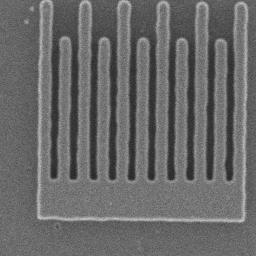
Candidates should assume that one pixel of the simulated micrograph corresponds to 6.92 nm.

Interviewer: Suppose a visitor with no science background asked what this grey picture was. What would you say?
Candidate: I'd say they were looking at groups of lines, slits or small figures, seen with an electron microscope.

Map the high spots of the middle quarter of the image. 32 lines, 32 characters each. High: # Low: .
##..##...##..###..###..###..###.
##..##...##...##..###..###..###.
##..###..##...##..###..###..###.
##..###..##..###..###..###..###.
##..##...##..###..###..###..###.
##..##...##..###..###..###..###.
##..##..###...##..###..###..###.
##..##..###..###..###..###..##..
##..##..###..###..###..###..###.
##..##..###..###..###..###..###.
##..##..###..###..###..###..###.
##..##..####.###..###..###..###.
##..##..####.###..###..###..###.
#...##..###..###..###..###..###.
#...##..###..###..###..###..##..
#...##..###..###..###..###..###.
#...##..###..###..###..###..###.
#...##..###..###..###..###..###.
#...##..###..###..###..###..###.
#...##..###..###..###..###..##..
#...##..###..###..###..###..##..
#...##..###..###..###..###..###.
#..###..###..###..###..###..###.
##.###..###..###..###..###..##..
##.###..###..###..###..###..##..
#..###..###..###..###..###..##..
#..###..###..###..###..###..##..
#...##..###..###..###..###..##..
##.####.###..###..###..###..###.
################################
################################
################################